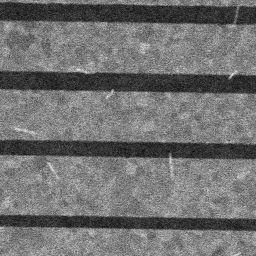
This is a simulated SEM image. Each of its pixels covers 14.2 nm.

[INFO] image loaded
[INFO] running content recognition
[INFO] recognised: one or a few lines or trenches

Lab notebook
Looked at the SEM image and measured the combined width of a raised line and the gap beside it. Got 0.986 um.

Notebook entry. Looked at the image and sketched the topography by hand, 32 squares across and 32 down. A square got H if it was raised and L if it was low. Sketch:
LLLLLLLLLLLLLLLLHHHHHHHHHHHHHHHH
LLLLLLLLLLLLLLLLLLLLLLLLLLLLLLLL
LLLLLLLLLLLLLLLLLLLLLLLLLLLLLLLL
HHHHHHHHHHHHHHHHHHHHHHHHHHHHHHHH
HHHHHHHHHHHHHHHHHHHHHHHHHHHHHHHH
HHHHHHHHHHHHHHHHHHHHHHHHHHHHHHHH
HHHHHHHHHHHHHHHHHHHHHHHHHHHHHHHH
HHHHHHHHHHHHHHHHHHHHHHHHHHHHHHHH
HHHHHHHHHHHHHHHHHHHHHHHHHHHHHHHH
LLLLLLLLLLLLLLLLLLLLLLLLLLLLLLLL
LLLLLLLLLLLLLLLLLLLLLLLLLLLLLLLL
HHHHHHHHHHHHHHHLLLLLLLLLLLLLLLLL
HHHHHHHHHHHHHHHHHHHHHHHHHHHHHHHH
HHHHHHHHHHHHHHHHHHHHHHHHHHHHHHHH
HHHHHHHHHHHHHHHHHHHHHHHHHHHHHHHH
HHHHHHHHHHHHHHHHHHHHHHHHHHHHHHHH
HHHHHHHHHHHHHHHHHHHHHHHHHHHHHHHH
LLLLLLLLLHHHHHHHHHHHLHHHHHHHLHHH
LLLLLLLLLLLLLLLLLLLLLLLLLLLLLLLL
HLLLLLLLLLLLLLLLLLLLLLLLLLLLLLLL
HHHHHHHHHHHHHHHHHHHHHHHHHHHHHHHH
HHHHHHHHHHHHHHHHHHHHHHHHHHHHHHHH
HHHHHHHHHHHHHHHHHHHHHHHHHHHHHHHH
HHHHHHHHHHHHHHHHHHHHHHHHHHHHHHHH
HHHHHHHHHHHHHHHHHHHHHHHHHHHHHHHH
HHHHHHHHHHHHHHHHHHHHHHHHHHHHHHHH
HHHHHHHHHHHHHHHHHHHHHHHHHHHHHHHH
LLLLLLLLLLLLLLLLLLLLLLLLLLLLLLLL
HHHHHHLLLLLLLLLLLLLLLLLLLLLLLLLL
HHHHHHHHHHHHHHHHHHHHHHHHHHHHHHHH
HHHHHHHHHHHHHHHHHHHHHHHHHHHHHHHH
HHHHHHHHHHHHHHHHHHHHHHHHHHHHHHHH